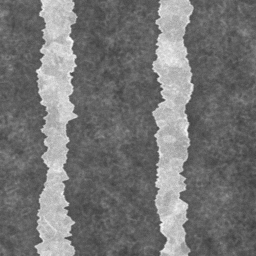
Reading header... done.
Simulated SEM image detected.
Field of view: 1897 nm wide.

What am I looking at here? one or a few lines or trenches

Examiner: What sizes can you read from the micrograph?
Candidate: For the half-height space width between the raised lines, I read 660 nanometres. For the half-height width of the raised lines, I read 195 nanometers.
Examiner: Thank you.